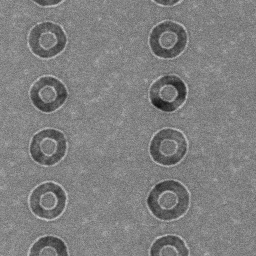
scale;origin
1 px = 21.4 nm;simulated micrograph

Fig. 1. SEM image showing a regular array of ring-shaped raised bodies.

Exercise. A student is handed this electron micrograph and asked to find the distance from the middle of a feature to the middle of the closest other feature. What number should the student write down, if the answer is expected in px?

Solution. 53.5